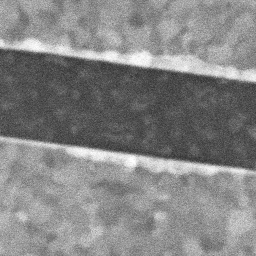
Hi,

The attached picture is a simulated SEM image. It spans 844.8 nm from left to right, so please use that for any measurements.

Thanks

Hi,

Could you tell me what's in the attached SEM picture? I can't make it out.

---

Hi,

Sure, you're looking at one or a few lines or trenches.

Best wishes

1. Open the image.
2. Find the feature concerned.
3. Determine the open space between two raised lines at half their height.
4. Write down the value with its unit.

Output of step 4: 302 nanometres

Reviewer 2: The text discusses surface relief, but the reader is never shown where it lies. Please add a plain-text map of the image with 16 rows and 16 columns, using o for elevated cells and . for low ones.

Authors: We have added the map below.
oooooooooooooooo
oooooooooooooooo
oooooooooooooooo
.....ooooooooooo
............oooo
................
................
................
................
oooooo..........
oooooooooooooo..
oooooooooooooooo
oooooooooooooooo
oooooooooooooooo
oooooooooooooooo
oooooooooooooooo